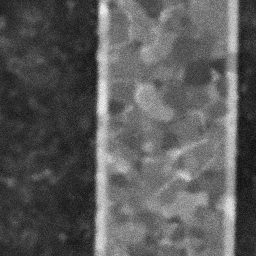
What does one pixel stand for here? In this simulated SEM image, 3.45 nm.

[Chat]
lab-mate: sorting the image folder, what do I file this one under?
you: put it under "one or a few lines or trenches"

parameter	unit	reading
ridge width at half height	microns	0.453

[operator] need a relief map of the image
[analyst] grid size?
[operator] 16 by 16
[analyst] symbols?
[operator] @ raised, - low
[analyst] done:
------@@@@@@@@@-
------@@@@@@@@@-
------@@@@@@@@@-
------@@@@@@@@@-
------@@@@@@@@@-
------@@@@@@@@@-
------@@@@@@@@@-
------@@@@@@@@@-
------@@@@@@@@--
------@@@@@@@@--
------@@@@@@@@--
------@@@@@@@@--
------@@@@@@@@--
------@@@@@@@@--
------@@@@@@@@--
------@@@@@@@@--